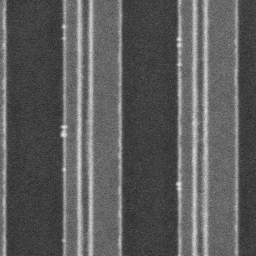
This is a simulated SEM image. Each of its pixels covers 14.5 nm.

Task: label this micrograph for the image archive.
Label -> lines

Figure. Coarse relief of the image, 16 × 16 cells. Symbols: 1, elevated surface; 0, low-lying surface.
0000111000011110
0000111000011110
0000111000011110
0000111000011110
0000111000011110
0000111000011110
0000111000011110
0000111000011110
0000111000011110
0000111000011110
0000111000011110
0000111000011110
0000111000011110
0000111000011110
0000111000011110
0000111000011110